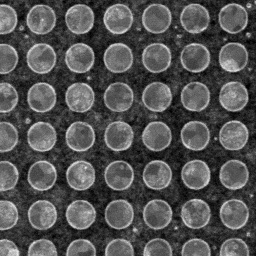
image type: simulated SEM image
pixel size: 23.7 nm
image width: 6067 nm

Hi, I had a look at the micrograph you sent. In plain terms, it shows a regular array of raised bodies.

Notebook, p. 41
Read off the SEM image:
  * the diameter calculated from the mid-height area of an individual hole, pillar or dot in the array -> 28.1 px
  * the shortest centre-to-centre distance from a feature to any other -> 908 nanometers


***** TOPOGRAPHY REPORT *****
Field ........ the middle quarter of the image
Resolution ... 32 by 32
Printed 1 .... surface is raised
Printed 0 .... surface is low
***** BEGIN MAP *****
01111110000111110000111111000011
00111100000011100000011110000001
00000000000000000000000000000000
00000000000000000000000000000000
00000000000000000000000000000000
00111100000011110000011111000001
01111110000111111000111111000011
01111110001111111000111111100111
01111110001111111000111111100111
01111110001111111000111111000011
01111110000111111000011111000011
00011000000011100000001110000000
00000000000000000000000000000000
00000000000000000000000000000000
00000000000000000000000000000000
00111100000111110000011110000011
01111110000111111000111111000011
01111110001111111000111111100111
01111110001111111000111111100011
01111110000111111000111111000011
01111110000111110000011111000001
00011000000000000000000000000000
00000000000000000000000000000000
00000000000000000000000000000000
00000000000000000000001110000000
00111110000111110000011111000011
01111110000111111000111111100011
01111111001111111000111111100011
01111111001111111000111111100011
01111110000111111000111111000011
00111100000011110000011110000001
00000000000000000000000000000000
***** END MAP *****